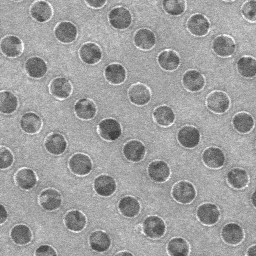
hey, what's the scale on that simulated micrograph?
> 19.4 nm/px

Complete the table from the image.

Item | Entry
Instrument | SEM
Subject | a regular array of raised bodies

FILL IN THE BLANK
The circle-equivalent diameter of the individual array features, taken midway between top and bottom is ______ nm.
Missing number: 447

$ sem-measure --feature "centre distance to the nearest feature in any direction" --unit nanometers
621